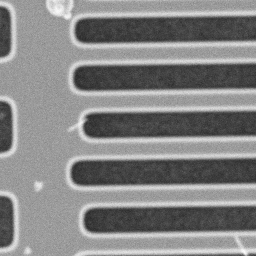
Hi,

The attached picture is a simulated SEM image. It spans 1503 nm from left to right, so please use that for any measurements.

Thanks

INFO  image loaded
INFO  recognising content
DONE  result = groups of lines, slits or small figures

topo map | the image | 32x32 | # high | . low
################################
.###############################
..########......................
..#######.......................
..#######.......................
..#########......###############
.###############################
################################
#########.......................
#########.......................
#########.......................
###########.####################
.###############################
..##############################
..#########.....................
..########......................
..########......................
..##############################
.###############################
################################
#########.......................
#########.......................
#########.......................
################################
.###############################
..##############################
..#########.....................
..########......................
..#########.....................
..##############################
..##############################
#############################.#.